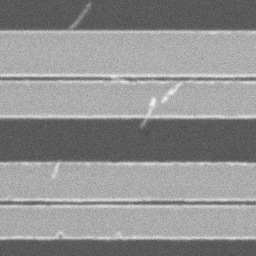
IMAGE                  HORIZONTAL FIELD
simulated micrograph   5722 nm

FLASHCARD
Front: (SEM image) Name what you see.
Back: lines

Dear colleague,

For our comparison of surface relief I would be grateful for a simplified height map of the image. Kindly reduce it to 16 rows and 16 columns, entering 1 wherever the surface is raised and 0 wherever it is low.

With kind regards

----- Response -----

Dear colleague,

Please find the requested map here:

1111111111111111
1111111111111111
0000000000000000
0000000000000000
0000000000000000
0000000000000000
0000000000000000
1111111111111111
1111111111111111
1111111111111111
0000000000000000
0000000000000000
0000000000000000
0000000000000000
0000000000000000
1111111111111111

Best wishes